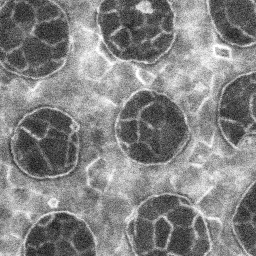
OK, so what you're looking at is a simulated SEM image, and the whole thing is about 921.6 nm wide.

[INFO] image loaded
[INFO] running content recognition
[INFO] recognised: raised bodies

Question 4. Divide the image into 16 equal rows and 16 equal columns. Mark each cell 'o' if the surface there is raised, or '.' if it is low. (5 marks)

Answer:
oooo..ooooo..ooo
oooo..ooooo..ooo
oooo..ooooo...oo
oooo...ooo......
.oo.............
..............oo
........ooo...oo
.oooo..ooooo..oo
.oooo..ooooo..o.
.oooo...ooo.....
.oooo...........
................
.........ooo...o
...oo...ooooo..o
..oooo..ooooo..o
.ooooo..ooooo..o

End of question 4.